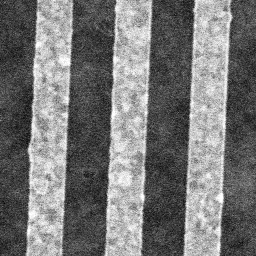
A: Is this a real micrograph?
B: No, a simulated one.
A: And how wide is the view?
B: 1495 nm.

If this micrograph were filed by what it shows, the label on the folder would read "one or a few lines or trenches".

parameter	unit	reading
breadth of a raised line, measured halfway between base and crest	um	0.198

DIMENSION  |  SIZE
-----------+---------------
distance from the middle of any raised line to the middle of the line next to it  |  78.7 pixels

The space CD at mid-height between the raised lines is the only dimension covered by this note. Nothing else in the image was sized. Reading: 262 nm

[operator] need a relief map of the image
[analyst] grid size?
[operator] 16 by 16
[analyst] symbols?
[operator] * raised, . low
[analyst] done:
..**...**...**..
..**...**...**..
..**...**...**..
..**...**...**..
..**...**...**..
..**...**...**..
..**...**...**..
..**...**...**..
..**...**...**..
..**...**...**..
..**...**...**..
..**...**...**..
..**...**...**..
..**...**...**..
..**...**...**..
..**...**...**..